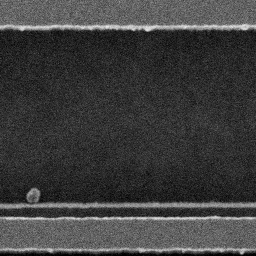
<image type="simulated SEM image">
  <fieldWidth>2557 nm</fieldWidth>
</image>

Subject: lines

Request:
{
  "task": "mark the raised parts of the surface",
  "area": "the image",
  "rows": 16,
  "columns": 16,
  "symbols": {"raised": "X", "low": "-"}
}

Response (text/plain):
XXXXXXXXXXXXXXXX
XXXXXXXXXXXXXXXX
----------------
----------------
----------------
----------------
----------------
----------------
----------------
----------------
----------------
----------------
----------------
XXXXXXXXXXXXXXXX
XXXXXXXXXXXXXXXX
XXXXXXXXXXXXXXXX